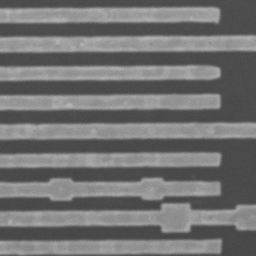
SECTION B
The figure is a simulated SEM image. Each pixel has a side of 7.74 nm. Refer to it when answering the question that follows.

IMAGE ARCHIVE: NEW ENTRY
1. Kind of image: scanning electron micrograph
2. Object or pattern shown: wiring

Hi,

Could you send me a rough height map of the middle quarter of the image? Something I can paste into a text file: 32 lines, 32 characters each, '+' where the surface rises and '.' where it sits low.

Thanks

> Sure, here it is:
................................
++++++++++++++++++++++++++++++++
++++++++++++++++++++++++++++++++
++++++++++.+++++++++++++++++++++
................................
................................
................................
................................
++++++++++++++++++++++++++++++++
++++++++++++++++++++++++++++++++
++++++++++++++++++++++.+++++++++
................................
................................
................................
................................
++++++++++++++++++++++++++++++++
++++++++++++++++++++++++++++++++
++++++++++++++++++++++++++++++++
................................
................................
................................
................................
................+++++........+++
++++++++++++++++++++++++++++++++
++++++++++++++++++++++++++++++++
................................
................................
................................
................................
++.................++++++.......
++++++++++++++++++++++++++++++++
++++++++++++++++++++++++++++++++